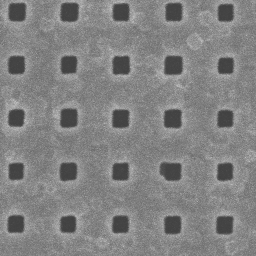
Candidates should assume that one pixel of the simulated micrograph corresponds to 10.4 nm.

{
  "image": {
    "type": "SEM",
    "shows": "a regular array of holes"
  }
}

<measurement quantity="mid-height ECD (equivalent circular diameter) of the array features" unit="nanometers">207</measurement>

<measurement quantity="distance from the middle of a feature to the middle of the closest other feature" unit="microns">0.54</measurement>